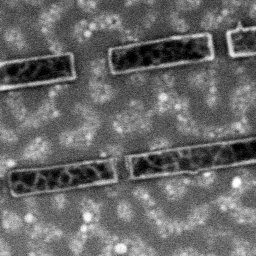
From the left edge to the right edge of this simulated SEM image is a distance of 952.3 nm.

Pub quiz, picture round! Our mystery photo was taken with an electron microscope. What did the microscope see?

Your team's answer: one or a few lines or trenches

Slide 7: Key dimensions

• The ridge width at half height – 0.0879 micrometres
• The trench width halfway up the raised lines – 83.7 px